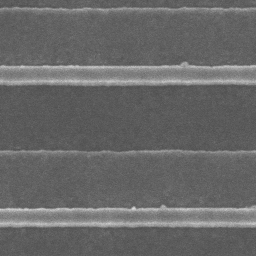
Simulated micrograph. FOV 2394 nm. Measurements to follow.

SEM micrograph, lines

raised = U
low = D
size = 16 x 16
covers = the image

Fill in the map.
DDDDDDDDDDDDDDDD
UUUUUUUUUUUUUUUU
UUUUUUUUUUUUUUUU
UUUUUUUUUUUUUUUU
UUUUUUUUUUUUUUUU
DDDDDDDDDDDDDDDD
DDDDDDDDDDDDDDDD
DDDDDDDDDDDDDDDD
DDDDDDDDDDDDDDDD
DUUUUDUDDUUUDDDU
UUUUUUUUUUUUUUUU
UUUUUUUUUUUUUUUU
UUUUUUUUUUUUUUUU
UUUUUUUUUUUUUUUU
DDDDDDDDDDDDDDDD
DDDDDDDDDDDDDDDD